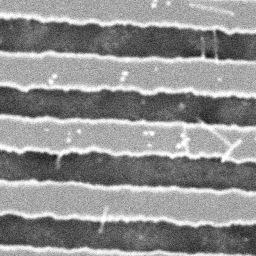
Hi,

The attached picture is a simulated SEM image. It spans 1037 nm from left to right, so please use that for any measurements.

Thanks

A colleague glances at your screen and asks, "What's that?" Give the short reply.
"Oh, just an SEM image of lines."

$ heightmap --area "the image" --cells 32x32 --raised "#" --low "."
################################
################################
.....###########################
......................##########
................................
................................
#.....#.........................
#############################...
################################
################################
################################
.................######.########
................................
................................
##..............................
########################.#......
################################
################################
################################
.....................#.#########
................................
................................
................................
#######################.........
################################
################################
################################
...........#####################
................................
................................
................................
################...##...........